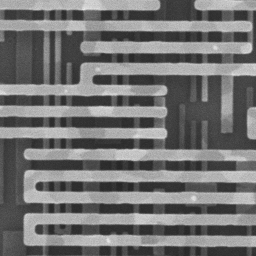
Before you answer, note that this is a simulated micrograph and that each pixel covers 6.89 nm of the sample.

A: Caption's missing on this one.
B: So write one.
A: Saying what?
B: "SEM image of wiring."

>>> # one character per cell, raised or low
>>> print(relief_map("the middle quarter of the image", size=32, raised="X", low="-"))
----XXXXXXXXXXXXXXXXXXXXXXXXXXXX
----XXXXXXXXXXXXXXXXXXXXXXXXXXXX
----XXXXXXXXXXXXXXXXXXXXXXXXXXXX
----XXX-------------------------
----XXX-------------------------
XXXXXXXXXXXXXXXXXXXXXXXXX-------
XXXXXXXXXXXXXXXXXXXXXXXXXX------
XXXXXXXXXXXXXXXXXXXXXXXXX-------
--------------------------------
--------------------------------
--------------------------------
XXXXXXXXXXXXXXXXXXXXXXXXXX------
XXXXXXXXXXXXXXXXXXXXXXXXXX------
--------------------------------
--------------------------------
--------------------------------
XXXXXXXXXXXXXXXXXXXXXXXXXX------
XXXXXXXXXXXXXXXXXXXXXXXXXX------
-----------------------XX-------
--------------------------------
--------------------------------
XXXXXXXXXXXXXXXXXXXX-XXXXX------
XXXXXXXXXXXXXXXXXXXXXXXXXXXXXXXX
XXXXXXXXXXXXXXXXXXXXXXXXXXXXXXXX
--------------------------------
--------------------------------
--------------------------------
XXXXXXXXXXXXXXXXXXXXXXXXXXXXXXXX
XXXXXXXXXXXXXXXXXXXXXXXXXXXXXXXX
--------------------------------
--------------------------------
--------------------------------